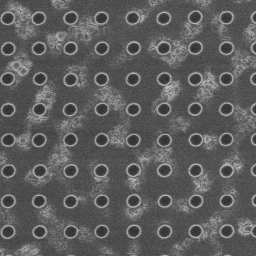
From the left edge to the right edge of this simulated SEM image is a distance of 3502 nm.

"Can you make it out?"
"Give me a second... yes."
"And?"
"a regular array of holes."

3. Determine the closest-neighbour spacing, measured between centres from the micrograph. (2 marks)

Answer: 0.412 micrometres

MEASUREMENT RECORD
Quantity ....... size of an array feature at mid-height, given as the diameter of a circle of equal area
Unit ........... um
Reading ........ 0.16